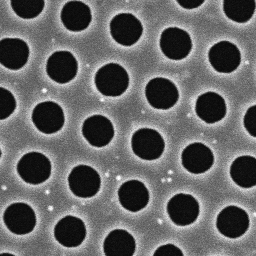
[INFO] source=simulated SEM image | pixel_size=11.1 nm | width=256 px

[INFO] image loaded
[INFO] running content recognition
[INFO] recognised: a regular array of holes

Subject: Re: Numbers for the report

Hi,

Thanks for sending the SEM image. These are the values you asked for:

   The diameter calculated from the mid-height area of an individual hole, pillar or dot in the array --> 364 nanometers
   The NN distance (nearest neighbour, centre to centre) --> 51.4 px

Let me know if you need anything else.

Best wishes